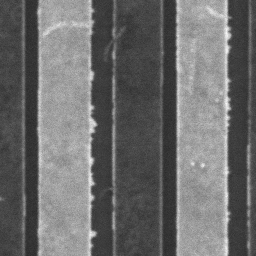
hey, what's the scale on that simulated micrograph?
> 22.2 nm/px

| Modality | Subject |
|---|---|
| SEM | lines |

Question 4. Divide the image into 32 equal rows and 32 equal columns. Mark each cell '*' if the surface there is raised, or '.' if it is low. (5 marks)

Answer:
***..******...******..******...*
***..******...******..******...*
***..******...******..******...*
***..******...******..******...*
***..******...******..******...*
***..******...******..******...*
***..******...******..******...*
***..******...******..******...*
***..******...******..******...*
***..******...******..******...*
***..******...******..******...*
***..******...******..******...*
***..******...******..******...*
***..******...******..******...*
***..******...******..******...*
***..******...******..******...*
***..******...******..******...*
***..******...******..******...*
***..******...******..******...*
***..******...******..******...*
***..******...******..******...*
***..******...******..******...*
***..******...******..******...*
***..******...******..******...*
***..******...******..******...*
***..******...******..******...*
***..******...******..******...*
***..******...******..******...*
***..******...******..******...*
***..******...******..******...*
***..******...******..******...*
***..******...******..******...*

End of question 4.